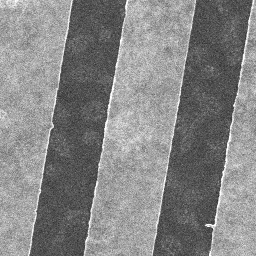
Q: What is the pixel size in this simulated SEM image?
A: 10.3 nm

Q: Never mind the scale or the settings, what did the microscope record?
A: one or a few lines or trenches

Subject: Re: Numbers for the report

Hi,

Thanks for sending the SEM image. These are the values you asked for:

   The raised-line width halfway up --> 699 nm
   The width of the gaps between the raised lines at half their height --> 0.562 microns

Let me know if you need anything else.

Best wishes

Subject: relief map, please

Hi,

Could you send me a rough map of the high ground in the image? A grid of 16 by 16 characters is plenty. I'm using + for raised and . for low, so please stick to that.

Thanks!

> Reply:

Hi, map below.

++++....++++....
++++....++++....
++++....++++...+
++++...+++++...+
++++...++++....+
++++...++++....+
+++....++++....+
+++....++++....+
+++....++++...++
+++...+++++...++
+++...++++....++
+++...++++....++
++....++++....++
++....++++....++
++....++++...+++
++...+++++...+++